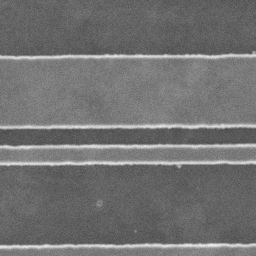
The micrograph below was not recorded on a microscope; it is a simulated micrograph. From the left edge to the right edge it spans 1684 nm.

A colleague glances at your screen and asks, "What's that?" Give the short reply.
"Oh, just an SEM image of lines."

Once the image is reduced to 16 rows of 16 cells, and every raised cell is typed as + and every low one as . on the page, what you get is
................
................
................
......+++.+++.++
++++++++++++++++
++++++++++++++++
++++++++++++++++
++++++++++++++++
++++++++++++++++
++++++++++++++++
................
................
................
................
................
++++++++++++++++